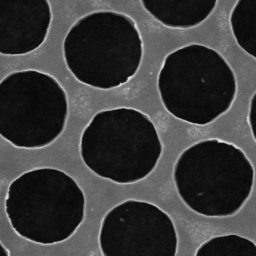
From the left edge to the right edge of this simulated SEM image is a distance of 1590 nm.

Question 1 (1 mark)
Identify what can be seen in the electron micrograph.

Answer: holes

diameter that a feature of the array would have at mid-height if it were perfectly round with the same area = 474 nm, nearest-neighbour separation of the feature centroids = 601 nanometers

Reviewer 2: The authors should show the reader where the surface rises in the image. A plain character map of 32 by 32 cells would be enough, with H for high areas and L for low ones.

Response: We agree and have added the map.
LLLLLLHHHHHHHHHHHHLLLLLLLLLHHHLL
LLLLLLHHHHHHHHHHHHHLLLLLLLHHHLLL
LLLLLLHHHHLLLLLLHHHHLLLLLHHHHLLL
LLLLLLHHHLLLLLLLLHHHHHHHHHHHHLLL
LLLLLLHHLLLLLLLLLHHHHHHHHHHHHLLL
LLLLLHHHLLLLLLLLLLHHHHHHHHHHHHLL
LLLHHHHHLLLLLLLLLLHHHHLLLLLHHHHL
HHHHHHHHLLLLLLLLLLHHHLLLLLLLHHHH
HHHHHHHHHLLLLLLLLHHHLLLLLLLLLHHH
HLLLLLHHHLLLLLLLHHHHLLLLLLLLLHHH
LLLLLLLHHHHLLLLHHHHHLLLLLLLLLHHH
LLLLLLLLHHHHHHHHHHHHLLLLLLLLLHHH
LLLLLLLLHHHHHHHHHHHHLLLLLLLLLHHL
LLLLLLLLHHHHHHHHHHHHHLLLLLLLHHHL
LLLLLLLLHHHHLLLLLLHHHHLLLLLHHHHL
LLLLLLLLHHHLLLLLLLLHHHHHHHHHHHHL
LLLLLLLLHHHLLLLLLLLHHHHHHHHHHHHH
HLLLLLLHHHLLLLLLLLLLHHHHHHHHHHHH
HHHHHHHHHHLLLLLLLLLLHHHHLLLLLHHH
HHHHHHHHHHLLLLLLLLLLHHHLLLLLLLLH
HHHHHHHHHHHLLLLLLLLHHHLLLLLLLLLH
HHHHLLLLHHHHLLLLLLLHHHLLLLLLLLLL
HHLLLLLLLHHHHHLLLHHHHHLLLLLLLLLL
HLLLLLLLLLHHHHHHHHHHHHLLLLLLLLLH
HLLLLLLLLLHHHHHHHHHHHHHLLLLLLLLH
HLLLLLLLLLHHHHHLLLLHHHHLLLLLLLHH
HLLLLLLLLLHHHHLLLLLLHHHHHLLLLHHH
HLLLLLLLLLHHHLLLLLLLLHHHHHHHHHHH
HHLLLLLLLHHHHLLLLLLLLLHHHHHHHHHH
HHHLLLLLLHHHHLLLLLLLLLHHHHHHLLHH
HHHHHHHHHHHHHLLLLLLLLLHHHHLLLLLL
LHHHHHHHHHHHHLLLLLLLLLHHHLLLLLLL